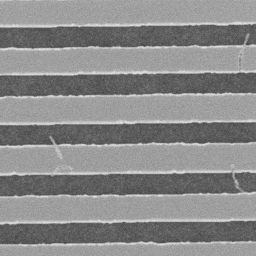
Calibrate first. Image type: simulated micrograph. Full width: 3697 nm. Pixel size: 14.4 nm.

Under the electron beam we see lines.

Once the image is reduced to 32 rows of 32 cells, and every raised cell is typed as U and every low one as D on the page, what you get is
UUUUUUUUUUUUUUUUUUUUUUUUUUUUUUUU
UUUUUUUUUUUUUUUUUUUUUUUUUUUUUUUU
UUUUUUUUUUUUUUUUUUUUUUUUUUUUUUUU
DDDDDDDDDDDDDDDDDDDDDDDDDDDDDDDD
DDDDDDDDDDDDDDDDDDDDDDDDDDDDDDDD
DDDDDDDDDDDDDDDDDDDDDDDDDDDDDDDD
UUUUUUUUUUUUUUUUUUUUUUUUUUUUUUUU
UUUUUUUUUUUUUUUUUUUUUUUUUUUUUUUU
UUUUUUUUUUUUUUUUUUUUUUUUUUUUUUUU
DDDDDDDDDDDDDDDDDDDDDDDDDDDDDDDD
DDDDDDDDDDDDDDDDDDDDDDDDDDDDDDDD
DDDDDDDDDDDDDDDDDDDDDDDDDDDDDDDD
UUUUUUUUUUUUUUUUUUUUUUUUUUUUUUUU
UUUUUUUUUUUUUUUUUUUUUUUUUUUUUUUU
UUUUUUUUUUUUUUUUUUUUUUUUUUUUUUUU
UUUUUUUDDDDDDDDDDDDDDDDDDDDDDDDD
DDDDDDDDDDDDDDDDDDDDDDDDDDDDDDDD
DDDDDDDDDDDDDDDDDDDDDDDDDDDDDDDD
UUUUUUUUUUUUUUUUUUUUUUUUUUUUUUUU
UUUUUUUUUUUUUUUUUUUUUUUUUUUUUUUU
UUUUUUUUUUUUUUUUUUUUUUUUUUUUUUUU
UUUUUUUUUUUUUUUUUUUUUUUUUUUUUUUU
DDDDDDDDDDDDDDDDDDDDDDDDDDDDDDDD
DDDDDDDDDDDDDDDDDDDDDDDDDDDDDDDD
DDDUDDDUUDUDUUUUUUUUUUUUUUUUUUUU
UUUUUUUUUUUUUUUUUUUUUUUUUUUUUUUU
UUUUUUUUUUUUUUUUUUUUUUUUUUUUUUUU
UUUUUUUUUUUUUUUUUUUUUUUUUUUUUUUU
DDDDDDDDDDDDDDDDDDDDDDDDDDDDDDDD
DDDDDDDDDDDDDDDDDDDDDDDDDDDDDDDD
DDDDDDDDDDDDDUUUUUUUUUUUUUUUUUUU
UUUUUUUUUUUUUUUUUUUUUUUUUUUUUUUU